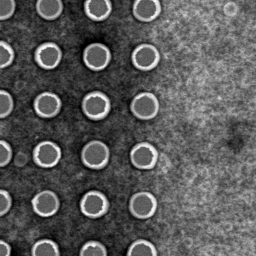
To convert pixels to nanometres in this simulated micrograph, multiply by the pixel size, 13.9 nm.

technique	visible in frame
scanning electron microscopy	a regular array of raised bodies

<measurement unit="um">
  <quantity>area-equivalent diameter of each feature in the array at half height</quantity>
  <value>0.358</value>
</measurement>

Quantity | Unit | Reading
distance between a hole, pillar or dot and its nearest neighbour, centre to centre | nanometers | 674